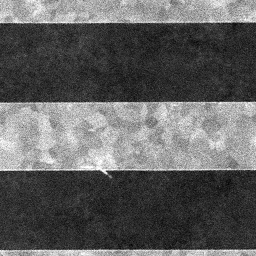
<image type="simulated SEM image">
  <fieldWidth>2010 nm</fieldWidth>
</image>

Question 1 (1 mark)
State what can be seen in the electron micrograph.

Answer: one or a few lines or trenches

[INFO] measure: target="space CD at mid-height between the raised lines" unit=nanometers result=626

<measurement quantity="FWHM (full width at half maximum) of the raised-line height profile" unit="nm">527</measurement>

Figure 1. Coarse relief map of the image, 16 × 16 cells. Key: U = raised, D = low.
UUUUUUUUUUUUUUUU
DDDDDDDDDDDDDDDD
DDDDDDDDDDDDDDDD
DDDDDDDDDDDDDDDD
DDDDDDDDDDDDDDDD
DDDDDDDDDDDDDDDD
UUUUUUUUUUUUUUUU
UUUUUUUUUUUUUUUU
UUUUUUUUUUUUUUUU
UUUUUUUUUUUUUUUU
UUUUUUUUUUUUUUUU
DDDDDDDDDDDDDDDD
DDDDDDDDDDDDDDDD
DDDDDDDDDDDDDDDD
DDDDDDDDDDDDDDDD
DDDDDDDDDDDDDDDD